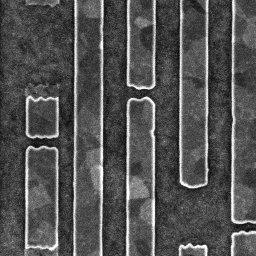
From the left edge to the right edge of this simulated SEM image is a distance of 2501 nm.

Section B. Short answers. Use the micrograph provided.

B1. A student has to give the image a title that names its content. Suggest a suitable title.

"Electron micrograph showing parallel lines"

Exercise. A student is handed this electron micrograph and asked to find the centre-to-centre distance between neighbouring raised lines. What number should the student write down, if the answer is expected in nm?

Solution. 499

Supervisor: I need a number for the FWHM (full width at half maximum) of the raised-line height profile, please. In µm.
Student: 0.26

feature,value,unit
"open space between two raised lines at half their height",0.252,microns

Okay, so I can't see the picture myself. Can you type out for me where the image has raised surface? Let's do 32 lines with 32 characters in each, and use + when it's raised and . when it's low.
.........++++...+++....+++...+++
.........++++...+++....+++...+++
.........++++...+++....+++...+++
.........++++...+++....+++...+++
.........++++...+++....+++...+++
.........++++...+++....+++...+++
.........++++...+++....+++...+++
.........++++...+++....+++...+++
.........++++...+++....+++...+++
.........++++...+++....+++...+++
.........++++...+++....+++...+++
.........++++..........+++...+++
...++++..++++...+++....+++...+++
...++++..++++...+++....+++...+++
...++++..++++...+++....+++...+++
...++++..++++...+++....+++...+++
...++++..++++...+++....+++...+++
.........++++...+++....+++...+++
.....+...++++...+++....+++...+++
...++++..++++...+++....+++...+++
...++++..++++...+++....+++...+++
...++++..++++...+++....+++...+++
...++++..++++...+++....+++...+++
...++++..++++...+++..........+++
...++++..++++...+++..........+++
...++++..++++...+++..........+++
...++++..++++...+++..........+++
...++++..++++...+++..........+++
...++++..++++...+++.............
...++++..++++...+++..........+++
...++++..++++...+++..........+++
.........++++...+++....+++...+++